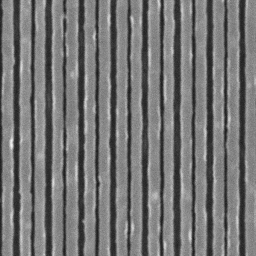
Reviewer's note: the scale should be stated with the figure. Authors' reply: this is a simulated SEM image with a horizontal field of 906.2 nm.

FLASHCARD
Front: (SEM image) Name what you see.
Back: parallel lines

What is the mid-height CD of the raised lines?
0.0368 microns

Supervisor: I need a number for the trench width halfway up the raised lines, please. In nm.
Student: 24.4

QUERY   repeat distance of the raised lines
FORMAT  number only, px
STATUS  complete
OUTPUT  16.1